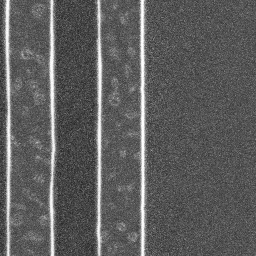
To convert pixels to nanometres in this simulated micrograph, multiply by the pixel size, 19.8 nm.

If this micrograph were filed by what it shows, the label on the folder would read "one or a few lines or trenches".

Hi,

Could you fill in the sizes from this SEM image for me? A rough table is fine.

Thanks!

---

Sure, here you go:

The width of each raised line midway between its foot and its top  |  866 nanometres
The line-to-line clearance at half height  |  933 nanometres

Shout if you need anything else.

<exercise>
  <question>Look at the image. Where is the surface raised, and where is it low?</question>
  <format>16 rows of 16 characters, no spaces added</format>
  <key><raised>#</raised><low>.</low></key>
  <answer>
.##...###.......
###...###.......
###...###.......
###...###.......
###...###.......
.##...###.......
.##...###.......
.##...###.......
.##...###.......
.##...###.......
.##...###.......
.##...###.......
.##...###.......
.##...###.......
.##...###.......
.##...###.......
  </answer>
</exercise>